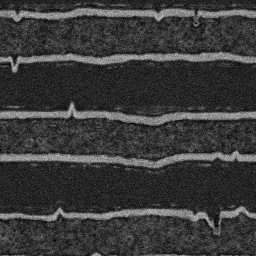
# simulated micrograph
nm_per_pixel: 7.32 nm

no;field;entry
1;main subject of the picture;one or a few lines or trenches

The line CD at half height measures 0.328 um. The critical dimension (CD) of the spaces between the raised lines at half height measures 0.403 micrometres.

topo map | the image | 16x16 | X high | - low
----------------
XXXXXXXXXXXXXXXX
XXXXXXXXXXXXXXXX
XXXXXXXXXXXXXXXX
----------------
----------------
----------------
XXXXXXXXX-XXXXXX
XXXXXXXXXXXXXXXX
XXXXXXXXXXXXXXXX
----------------
----------------
----------------
XX-XXXXXXXXXX-XX
XXXXXXXXXXXXXXXX
XXXXXXXXXXXXXXXX